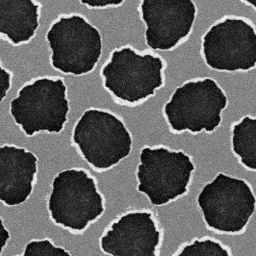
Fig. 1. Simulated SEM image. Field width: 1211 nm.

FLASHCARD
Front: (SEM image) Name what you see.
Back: holes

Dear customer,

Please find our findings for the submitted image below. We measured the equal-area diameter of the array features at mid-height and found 56.8 pixels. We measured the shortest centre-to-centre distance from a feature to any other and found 316 nanometers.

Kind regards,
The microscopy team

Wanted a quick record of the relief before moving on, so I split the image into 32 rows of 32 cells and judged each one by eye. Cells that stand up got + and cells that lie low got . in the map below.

.....++++++....+++......+++++++.
.....+++++++++++++......++++++++
.....++....+++++++......++++...+
.....+......++++++......++......
....++......++++++.....+++......
++++++.......++++++...++++......
+++++++......+...++++++++.......
++++++......++......++++++......
+++++++.....+.......+++++++....+
.++++++++++++.......++++++++++++
.+++....+++++.......+++....+++++
.+......++++++.....+++......++++
++......+++++++...+++.......++++
+........++++++++++++.......++++
++......++....+++++++.......++++
++......++.....++++++......++...
+++..++++.......++++++++.++++...
+++++++++.......+++++++++++++...
...+++++++......++...++++++++...
....++++++......++.....+++++++..
....+++++++...+++.......++++++..
.....+++...++++++.......++++++++
....+++.....+++++.......+++...++
....+++.....+++++.......+......+
....++.......+++++....+++.......
+.++++.......++++++.+++++.......
++++++.......++++++++++++.......
+++++++.....+++....+++++++.....+
.+++++++...+++......++++++....++
.++++++++++++.......++++++++++++
.+++...++++++.......++++...+++++
+++.....+++++.......++.......+++